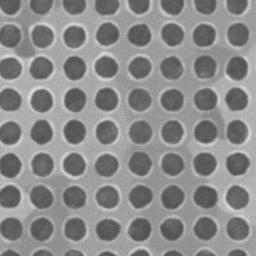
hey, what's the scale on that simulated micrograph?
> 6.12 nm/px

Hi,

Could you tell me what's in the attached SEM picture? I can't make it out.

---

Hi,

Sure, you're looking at a regular array of holes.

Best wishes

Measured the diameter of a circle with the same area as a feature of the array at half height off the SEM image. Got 0.151 µm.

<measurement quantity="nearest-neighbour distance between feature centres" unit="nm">194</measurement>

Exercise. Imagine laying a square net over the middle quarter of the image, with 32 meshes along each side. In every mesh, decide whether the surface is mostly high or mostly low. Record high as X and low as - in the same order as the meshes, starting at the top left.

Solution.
------X-------XX------XX------XX
------XX-----XXX------XX------XX
-----XXX-----XXX------XX------XX
X----XXXX---XXXXX----XXXX----XXX
XXXXXXXXXXXXXXXXXXXXXXXXXXXXXXXX
XXXXXXXXXXXXXXXXXXXXXXXXXXXXXXXX
X----XXXX----XXXX----XXXX----XXX
-----XXX-----XXX-----XXX------XX
------XX------XX------XX------XX
-----XXX------XX------XX------XX
-----XXX-----XXX------XX------XX
X---XXXXX----XXXX----XXXX----XXX
XXXXXXXXXXXXXXXXXXXXXXXXXXXXXXXX
XXXXXXXXXXXXXXXXXXXXXXXXXXXXXXXX
X----XXXX----XXXX----XXXXX---XXX
-----XXX-----XXX------XXX-----XX
-----XXX------XX------XX------XX
------XX------XX------XX------XX
-----XXX-----XXX------XX------XX
-----XXXX----XXXX----XXXX----XXX
XXXXXXXXXXXXXXXXXXXXXXXXXXX-XXXX
XXXXXXXXXXXXXXXXXXXXXXXXXXXXXXXX
X---XXXXX---XXXXX---XXXXX----XXX
-----XXX-----XXX-----XXX------XX
-----XXX------XX------XX------XX
------X-------XX------XX------XX
-----XXX------XX------XXX-----XX
-----XXXX----XXXX----XXXX----XXX
XXXXXXXXXXXXXXXXXXXXXXXXXXXXXXXX
XXXXXXXXXXXXXXXXXXXXXXXXXXXXXXXX
XX--XXXXXX---XXXXX---XXXXX--XXXX
-----XXX------XXX-----XXX-----XX